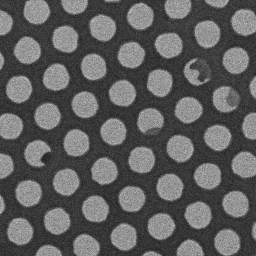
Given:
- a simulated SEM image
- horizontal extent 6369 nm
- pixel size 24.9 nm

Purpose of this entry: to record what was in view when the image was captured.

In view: a regular array of raised bodies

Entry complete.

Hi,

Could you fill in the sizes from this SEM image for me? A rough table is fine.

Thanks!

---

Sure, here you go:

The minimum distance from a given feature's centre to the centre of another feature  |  963 nanometres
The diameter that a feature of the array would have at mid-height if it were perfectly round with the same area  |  666 nanometres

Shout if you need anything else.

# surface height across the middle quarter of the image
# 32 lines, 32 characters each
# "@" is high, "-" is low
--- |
----@@@@@@-----@@@@-----------@-
@---@@@@@@@------------@@-----@@
@----@@@@@-----------@@@@@@---@@
@-----@@@------------@@@@@@----@
@------------@@@-----@@@@@@----@
@-----------@@@@@----@@@@@@-----
-----------@@@@@@@---@@@@@@-----
---@@@@----@@@@@@@----@@@@------
--@@@@@@---@@@@@@@------------@@
--@@@@@@----@@@@@------------@@@
--@@@@@@@-----@@------------@@@@
--@@@@@@------------@@@-----@@@@
---@@@@@-----------@@@@@----@@@@
----@@-------------@@@@@@---@@@@
----------@@@@@---@@@@@@@-----@@
----------@@@@@---@@@@@@@-------
--@@-----@@@@@@@---@@-----------
-@@@@----@@@@@@-----------------
@@@@@@----@@@@@------------@@@@-
@@@@@@----@@@@@-----------@@@@@@
@@@@@@--------------------@@@@@@
@@@@@@-----------@@@@@----@@@@@@
-@@@@------------@@@@@----@@@@@@
----------@-----@@@@@@@----@@@@@
--------@@@@----@@@@@@@-----@---
-------@@@@@@---@@@@@@----------
@@-----@@@@@@----@@@@@----------
@@@----@@@@@@-------------@-----
@@@@---@@@@@@-----------@@@@@---
@@@@----@@@@------------@@@@@@--
@@@@-------------------@@@@@@@--
@@@-----------@@@@@----@@@@@@@--